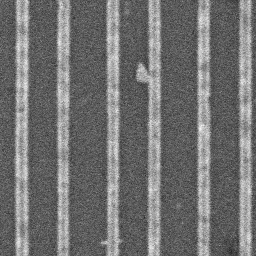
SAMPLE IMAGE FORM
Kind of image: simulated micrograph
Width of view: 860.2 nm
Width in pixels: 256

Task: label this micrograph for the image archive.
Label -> parallel lines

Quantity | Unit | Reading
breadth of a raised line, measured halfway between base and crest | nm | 30.2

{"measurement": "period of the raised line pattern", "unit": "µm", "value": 0.15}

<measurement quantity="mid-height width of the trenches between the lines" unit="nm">111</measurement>